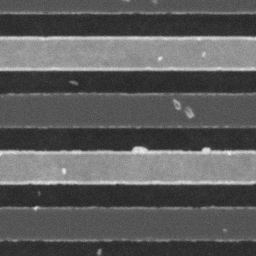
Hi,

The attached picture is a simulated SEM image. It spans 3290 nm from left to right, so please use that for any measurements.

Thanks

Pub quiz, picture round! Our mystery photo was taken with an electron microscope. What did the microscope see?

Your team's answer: lines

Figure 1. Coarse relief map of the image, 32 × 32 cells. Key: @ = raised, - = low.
@@@@@@@@@@@@@@@@@@@@@@@@@@@@@@@@
@@@@@@@@@@@@@@@@@@@@@@@@@@@@@@@@
--------------------------------
--------------------------------
--------------------------------
@@@@@@@@@@@@@@@@@@@@@@@@@@@@@@@@
@@@@@@@@@@@@@@@@@@@@@@@@@@@@@@@@
@@@@@@@@@@@@@@@@@@@@@@@@@@@@@@@@
@@@@@@@@@@@@@@@@@@@@@@@@@@@@@@@@
--------------------------------
--------------------------------
--------------------------------
@@@@@@@@@@@@@@@@@@@@@@@@@@@@@@@@
@@@@@@@@@@@@@@@@@@@@@@@@@@@@@@@@
@@@@@@@@@@@@@@@@@@@@@@@@@@@@@@@@
@@@@@@@@@@@@@@@@@@@@@@@@@@@@@@@@
--------------------------------
--------------------------------
-----------------@--------------
@@@@@@@@@@@@@@@@@@@@@@@@@@@@@@@@
@@@@@@@@@@@@@@@@@@@@@@@@@@@@@@@@
@@@@@@@@@@@@@@@@@@@@@@@@@@@@@@@@
@@@@@@@@@@@@@@@@@@@@@@@@@@@@@@@@
--------------------------------
--------------------------------
--------------------------------
@@@@@@@@@@@@@@@@@@@@@@@@@@@@@@@@
@@@@@@@@@@@@@@@@@@@@@@@@@@@@@@@@
@@@@@@@@@@@@@@@@@@@@@@@@@@@@@@@@
@@@@@@@@@@@@@@@@@@@@@@@@@@@@@@@@
--------------------------------
--------------------------------